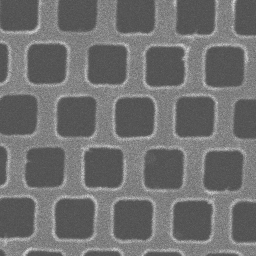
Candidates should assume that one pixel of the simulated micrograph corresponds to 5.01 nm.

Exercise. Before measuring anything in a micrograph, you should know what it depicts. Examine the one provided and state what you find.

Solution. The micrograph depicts a regular array of holes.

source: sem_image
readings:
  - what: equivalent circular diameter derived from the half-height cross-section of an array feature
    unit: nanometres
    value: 220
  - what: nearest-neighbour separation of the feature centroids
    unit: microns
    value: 0.293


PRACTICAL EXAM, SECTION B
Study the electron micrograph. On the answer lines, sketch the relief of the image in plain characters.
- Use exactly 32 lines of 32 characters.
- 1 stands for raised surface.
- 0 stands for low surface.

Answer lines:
00000110000011000001110000011000
00000110000011000001110000011000
00000110000011000001110000011000
00001110000011100001110000011000
11111111111111111111111111111100
01110001111101111111111111111111
01100000111000001100000111000001
01100000111000001100000111000001
01100000111000001100000111000001
01100000111000001100000111000001
11110001111100011100000111000011
11111111111111111111111111111111
00000110000011100001110000011100
00000110000011000001110000011000
00000110000011000001110000011000
00000110000011000001110000011000
00001110000011000001110000011000
11111111111111111111111111111111
01110000111101111111111111111111
01100000111000011100000111000011
01100000110000011100000111000011
01100000110000011100000110000011
01100000111000011100000110000011
11111111111110111110001111000011
11111111111111111111111111111111
00001110000011000001110000111000
00001110000011000001110000111000
00001110000011000001110000111000
00001110000011000001110000111000
00001110000111000001110000111000
11111111111111111111111111111111
11110001111000011110001111111111